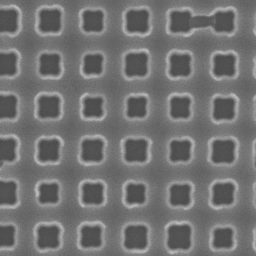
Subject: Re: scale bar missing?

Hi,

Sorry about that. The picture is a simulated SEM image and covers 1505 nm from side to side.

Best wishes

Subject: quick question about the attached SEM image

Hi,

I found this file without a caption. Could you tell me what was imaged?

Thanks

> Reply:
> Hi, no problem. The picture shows a regular array of holes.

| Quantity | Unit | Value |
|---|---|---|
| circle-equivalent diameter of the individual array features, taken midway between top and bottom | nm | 143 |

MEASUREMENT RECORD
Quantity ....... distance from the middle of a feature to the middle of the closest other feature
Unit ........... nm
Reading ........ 253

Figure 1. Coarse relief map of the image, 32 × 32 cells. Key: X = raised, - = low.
XXXXXXXXXXXXXXXXXXXXXXXXXXXXXXXX
--XXX---XXX--XXX---XXX--XXX--XXX
--XXX---XX---XXX---XX--------XXX
--XXX---XX---XXX---XX----X---XXX
XXXXXXXXXXXXXXXXXXXXXXXXXXXXXXXX
XXXXXXXXXXXXXXXXXXXXXXXXXXXXXXXX
XXXXXXXXXXXXXXXXXXXXXXXXXXXXXXXX
--XXX---XX---XXX---XX---XXX--XXX
--XXX---XX---XXX---XX---XXX--XXX
XXXXX-XXXXXXXXXX--XXX---XXX--XXX
XXXXXXXXXXXXXXXXXXXXXXXXXXXXXXXX
XXXXXXXXXXXXXXXXXXXXXXXXXXXXXXXX
--XXX--XXX---XXX--XXX---XXX--XXX
--XXX--XXX---XXX--XXX---XXX--XXX
--XXX--XXXX--XXX--XXX---XXX--XXX
XXXXXXXXXXXXXXXXXXXXXXXXXXXXXXXX
XXXXXXXXXXXXXXXXXXXXXXXXXXXXXXXX
--XXX--XXX---XXX--XXXX-XXXX--XXX
--XXX--XXX---XXX--XXX---XX---XXX
--XXX--XXX---XXX--XXX---XX---XXX
XXXXXXXXXXXXXXXXXXXXXXXXXXXXXXXX
XXXXXXXXXXXXXXXXXXXXXXXXXXXXXXXX
XXXXXXXXXXXXXXXXXXXXXXXXXXXXXXXX
--XXX--XXX---XXX--XXX---XXX--XXX
--XXX--XXX---XXX--XXX---XXX--XXX
--XXXXXXXXX-XXXX--XXX---XXX--XXX
XXXXXXXXXXXXXXXXXXXXXXXXXXXXXXXX
XXXXXXXXXXXXXXXXXXXXXXXXXXXXXXXX
--XXX--XXX---XXX--XXX---XXX--XXX
--XXX--XXX---XX----XX---XXX--XXX
--XXX--XXX---XX---XXX---XXX--XXX
XXXXXXXXXXXXXXXXXXXXXXXXXXXXXXXX